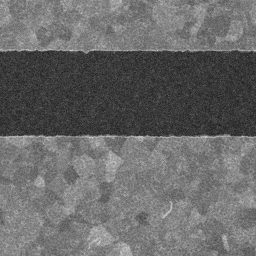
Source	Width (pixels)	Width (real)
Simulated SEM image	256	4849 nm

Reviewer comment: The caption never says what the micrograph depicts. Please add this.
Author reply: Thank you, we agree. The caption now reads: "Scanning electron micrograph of one or a few lines or trenches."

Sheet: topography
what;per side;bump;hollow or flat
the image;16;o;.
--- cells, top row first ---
oooooooooooooooo
oooooooooooooooo
oooooooooooooooo
................
................
................
................
................
..........o.....
oooooooooooooooo
oooooooooooooooo
oooooooooooooooo
oooooooooooooooo
oooooooooooooooo
oooooooooooooooo
oooooooooooooooo